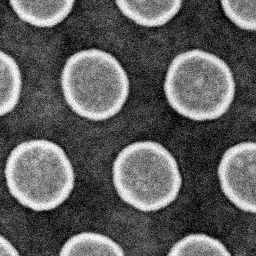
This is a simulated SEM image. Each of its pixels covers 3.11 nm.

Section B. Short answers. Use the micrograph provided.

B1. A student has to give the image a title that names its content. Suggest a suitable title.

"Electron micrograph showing raised bodies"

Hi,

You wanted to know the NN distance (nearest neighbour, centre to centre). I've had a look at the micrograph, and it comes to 325 nanometres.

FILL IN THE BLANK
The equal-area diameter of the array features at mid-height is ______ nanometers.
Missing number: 202